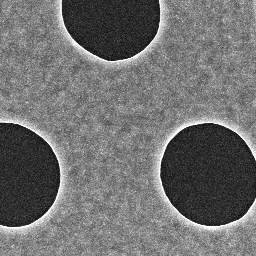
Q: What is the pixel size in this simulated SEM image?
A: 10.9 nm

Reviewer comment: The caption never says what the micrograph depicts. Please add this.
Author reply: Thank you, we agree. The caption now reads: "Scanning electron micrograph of holes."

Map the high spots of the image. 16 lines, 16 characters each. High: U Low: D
UUUUDDDDDDUUUUUU
UUUUDDDDDDUUUUUU
UUUUUDDDDDUUUUUU
UUUUUUDDUUUUUUUU
UUUUUUUUUUUUUUUU
UUUUUUUUUUUUUUUU
UUUUUUUUUUUUUUUU
UUUUUUUUUUUUUUUU
DDUUUUUUUUUDDDDU
DDDUUUUUUUDDDDDD
DDDDUUUUUUDDDDDD
DDDDUUUUUUDDDDDD
DDDUUUUUUUUDDDDD
DDDUUUUUUUUDDDDU
UUUUUUUUUUUUUUUU
UUUUUUUUUUUUUUUU